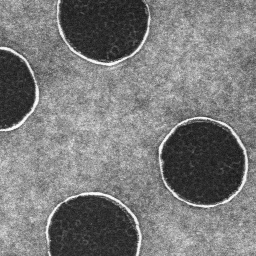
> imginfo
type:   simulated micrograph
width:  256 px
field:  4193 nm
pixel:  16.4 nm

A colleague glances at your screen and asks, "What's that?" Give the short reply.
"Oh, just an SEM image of raised bodies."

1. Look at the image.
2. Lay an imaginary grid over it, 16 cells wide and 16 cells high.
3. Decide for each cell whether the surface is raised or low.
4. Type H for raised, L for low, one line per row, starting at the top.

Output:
LLLLHHHHHLLLLLLL
LLLLHHHHHLLLLLLL
LLLLHHHHHLLLLLLL
HLLLLHHHLLLLLLLL
HHLLLLLLLLLLLLLL
HHLLLLLLLLLLLLLL
HHLLLLLLLLLLLLLL
HHLLLLLLLLLLHLLL
LLLLLLLLLLLHHHHL
LLLLLLLLLLHHHHHL
LLLLLLLLLLHHHHHL
LLLLLLLLLLHHHHHL
LLLLHHHLLLLHHHLL
LLLHHHHHLLLLLLLL
LLLHHHHHHLLLLLLL
LLLHHHHHHLLLLLLL